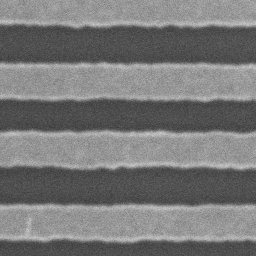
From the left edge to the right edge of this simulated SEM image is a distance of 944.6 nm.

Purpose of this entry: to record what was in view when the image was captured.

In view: lines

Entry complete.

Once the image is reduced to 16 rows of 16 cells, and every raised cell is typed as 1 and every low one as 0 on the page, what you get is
1111111111111111
0011111111111111
0000000000000000
0000000000000000
1111111111111111
1111111111111111
0000000000000000
0000000000000000
1111111111111111
1111111111111111
0000000000000000
0000000000000000
0000000000000000
1111111111111111
1111111111111111
0000000000000000